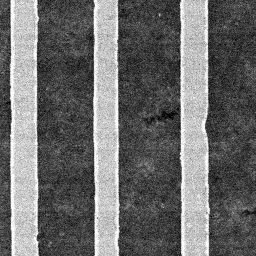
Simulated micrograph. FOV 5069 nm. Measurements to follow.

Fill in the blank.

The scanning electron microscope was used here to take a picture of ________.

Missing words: one or a few lines or trenches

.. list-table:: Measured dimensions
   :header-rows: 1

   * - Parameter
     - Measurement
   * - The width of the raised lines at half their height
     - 475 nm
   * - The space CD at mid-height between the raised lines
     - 1240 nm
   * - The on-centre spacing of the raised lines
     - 1690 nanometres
